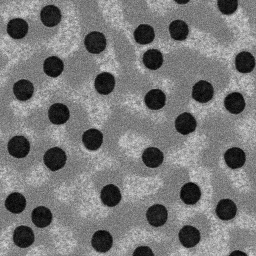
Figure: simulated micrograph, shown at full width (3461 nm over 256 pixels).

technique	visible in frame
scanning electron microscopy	a regular array of holes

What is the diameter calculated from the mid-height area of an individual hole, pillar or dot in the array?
301 nanometers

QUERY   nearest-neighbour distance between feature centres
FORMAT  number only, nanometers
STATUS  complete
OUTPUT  516